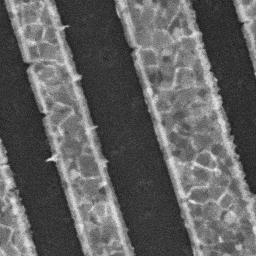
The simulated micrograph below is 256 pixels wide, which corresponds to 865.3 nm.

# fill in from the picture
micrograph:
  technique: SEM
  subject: one or a few lines or trenches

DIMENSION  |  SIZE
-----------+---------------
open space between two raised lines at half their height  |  231 nm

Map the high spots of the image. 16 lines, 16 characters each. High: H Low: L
LHHLLLLLHHHHLLLH
LHHLLLLLHHHHLLLH
LHHHLLLLHHHHLLLL
LLHHLLLLLHHHHLLL
LLHHLLLLLHHHHLLL
LLHHHLLLLHHHHLLL
LLLHHLLLLLHHHLLL
LLLHHLLLLLHHHHLL
LLLHHHLLLLHHHHLL
LLLLHHLLLLLHHHLL
LLLLHHLLLLLHHHHL
LLLLHHHLLLLHHHHL
HLLLLHHLLLLHHHHH
HLLLLHHLLLLLHHHH
HLLLLHHHLLLLHHHH
HHLLLLHHLLLLHHHH